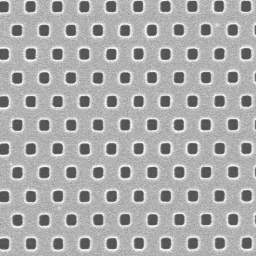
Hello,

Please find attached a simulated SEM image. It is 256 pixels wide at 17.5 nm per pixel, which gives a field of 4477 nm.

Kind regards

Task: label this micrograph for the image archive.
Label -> a regular array of holes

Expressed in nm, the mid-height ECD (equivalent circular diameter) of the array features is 202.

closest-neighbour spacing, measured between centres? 466 nm